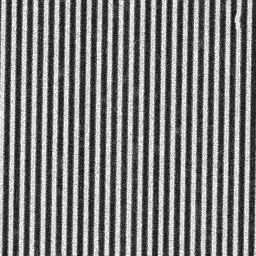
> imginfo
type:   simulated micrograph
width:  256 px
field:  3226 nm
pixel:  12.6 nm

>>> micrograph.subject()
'parallel lines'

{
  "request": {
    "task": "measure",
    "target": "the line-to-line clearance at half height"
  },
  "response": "6 px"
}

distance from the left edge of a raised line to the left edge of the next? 10.7 pixels